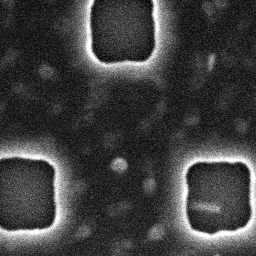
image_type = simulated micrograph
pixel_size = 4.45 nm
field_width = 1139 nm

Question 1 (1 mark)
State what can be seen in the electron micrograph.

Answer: holes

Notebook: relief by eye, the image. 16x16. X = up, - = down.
XXXXXX----XXXXXX
XXXXXX----XXXXXX
XXXXXX----XXXXXX
XXXXXX---XXXXXXX
XXXXXXXXXXXXXXXX
XXXXXXXXXXXXXXXX
XXXXXXXXXXXXXXXX
XXXXXXXXXXXXXXXX
XXXXXXXXXXXXXXXX
XXXXXXXXXXXXXXXX
---XXXXXXXXX----
---XXXXXXXXX----
---XXXXXXXXX----
----XXXXXXXX----
XXXXXXXXXXXX--XX
XXXXXXXXXXXXXXXX